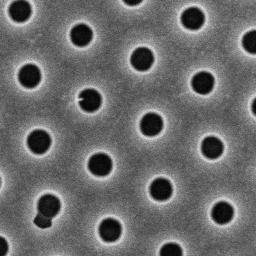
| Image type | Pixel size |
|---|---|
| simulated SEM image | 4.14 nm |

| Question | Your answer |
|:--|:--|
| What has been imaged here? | a regular array of holes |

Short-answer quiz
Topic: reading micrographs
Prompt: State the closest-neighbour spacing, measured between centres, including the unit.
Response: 269 nanometres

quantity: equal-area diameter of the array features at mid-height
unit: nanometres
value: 103